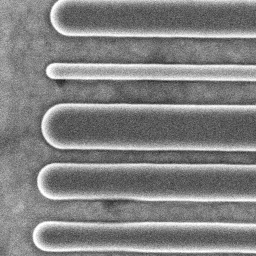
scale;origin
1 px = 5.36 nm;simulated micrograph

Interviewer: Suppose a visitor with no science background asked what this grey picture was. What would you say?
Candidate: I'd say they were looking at groups of lines, slits or small figures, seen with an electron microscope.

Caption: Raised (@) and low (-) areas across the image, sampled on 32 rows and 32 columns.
-------@@@@@@@@@@@@@@@@@@@@@@@@@
------@@@@@@@@@@@@@@@@@@@@@@@@@@
------@@@@@@@@@@@@@@@@@@@@@@@@@@
-------@@@@@@@@@@@@@@@@@@@@@@@@@
-----------------------@@@@@@@@@
--------------------------------
--------------------------------
--------------------------------
------@@@@@@@@@@@@@@@@@@@@@@@@@@
------@@@@@@@@@@@@@@@@@@@@@@@@@@
--------------------------------
--------------------------------
--------------------------------
------@@@@@@@@@@@@@@@@@@@@@@@@@@
------@@@@@@@@@@@@@@@@@@@@@@@@@@
-----@@@@@@@@@@@@@@@@@@@@@@@@@@@
-----@@@@@@@@@@@@@@@@@@@@@@@@@@@
------@@@@@@@@@@@@@@@@@@@@@@@@@@
-------@@@@@@@@@@@@@@@@@@@@@@@@@
--------------------------------
--------------------------------
-----@@@@@@@@@@@@@@@@@@@@@@@@@@@
-----@@@@@@@@@@@@@@@@@@@@@@@@@@@
-----@@@@@@@@@@@@@@@@@@@@@@@@@@@
------@@@@@@@@@@@@@@@@@@@@@@@@@@
--------------------------------
--------------------------------
--------------------------------
-----@@@@@@@@@@@@@@@@@@@@@@@@@@@
----@@@@@@@@@@@@@@@@@@@@@@@@@@@@
-----@@@@@@@@@@@@@@@@@@@@@@@@@@@
-------------------------------@